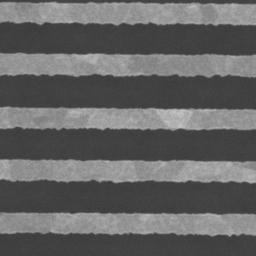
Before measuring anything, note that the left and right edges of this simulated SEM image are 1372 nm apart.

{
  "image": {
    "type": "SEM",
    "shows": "lines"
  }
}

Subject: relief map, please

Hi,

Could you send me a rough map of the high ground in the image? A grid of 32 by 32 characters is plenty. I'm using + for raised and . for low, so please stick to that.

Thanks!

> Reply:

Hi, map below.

+++++++++++++++++++++++++.+.++..
++++++++++++++++++++++++++++++++
++++++++++++++++++++++++++++++++
................................
................................
................................
................................
++++++++++++++++++++++++++++++++
++++++++++++++++++++++++++++++++
.........+....+++...+..+.++...++
................................
................................
................................
+++.............................
++++++++++++++++++++++++++++++++
++++++++++++++++++++++++++++++++
................................
................................
................................
................................
++++++++++++++++++++++++++++++++
++++++++++++++++++++++++++++++++
.+++...++++.++++++++++++++++++++
................................
................................
................................
................................
++++++++++++++++++++++++++++++++
++++++++++++++++++++++++++++++++
................................
................................
................................